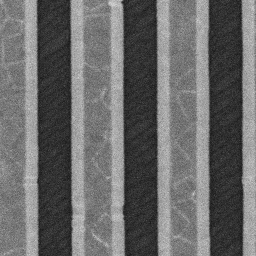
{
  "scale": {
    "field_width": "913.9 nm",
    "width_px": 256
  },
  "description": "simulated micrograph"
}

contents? one or a few lines or trenches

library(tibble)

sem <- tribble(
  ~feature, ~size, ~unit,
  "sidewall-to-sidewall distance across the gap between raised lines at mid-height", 0.154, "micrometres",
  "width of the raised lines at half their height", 0.151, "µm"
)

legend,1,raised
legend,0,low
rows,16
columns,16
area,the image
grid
1100011000111001
1100011000111001
1100011000111001
1100011000111001
1100011000111001
1100011000111001
1100011000111000
1100011000111001
1100011000111001
1100011000111001
1100011000111001
1100011000111001
1100011000111000
1100011000111000
1100011000111001
1100011000111001